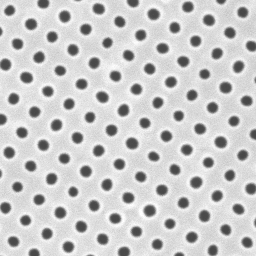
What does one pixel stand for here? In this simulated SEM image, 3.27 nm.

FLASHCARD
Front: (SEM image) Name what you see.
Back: a regular array of holes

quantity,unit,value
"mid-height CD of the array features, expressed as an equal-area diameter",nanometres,37.3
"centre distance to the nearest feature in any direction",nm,78.7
